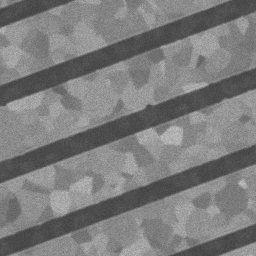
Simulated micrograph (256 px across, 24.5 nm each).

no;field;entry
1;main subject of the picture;one or a few lines or trenches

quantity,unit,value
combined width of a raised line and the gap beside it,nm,1780